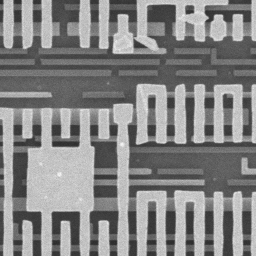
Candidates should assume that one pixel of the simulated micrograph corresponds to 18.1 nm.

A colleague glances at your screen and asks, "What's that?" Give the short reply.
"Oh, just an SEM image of wiring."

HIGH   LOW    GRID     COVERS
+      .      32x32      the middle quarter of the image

................................
................................
................................
................................
................................
..................+++++++....+..
..................+++++++...++..
..................+++..++...++..
..................+++..++...++..
..................+++..++...++..
.............++++.+++..++...++..
+...++...++..++++.+++..+++..++..
+...++...++..++++.+++..+++..++..
+...++...++..++++.+++..+++..++..
+...++...++..++++.+++..+++..++..
+...++...++...++..+++..++...++..
+...++...++...++..+++..++...++..
+...++...++...++..+++..++...++..
....++....+..+++..+++..++...+++.
....+++......+++..+++..++...+++.
....+++......+++................
+++++++......+++................
+++++++......+++................
+++++++.......++................
+++++++.......++................
+++++++.......++................
+++++++.......++................
+++++++.......++................
+++++++......+++................
+++++++......+++................
+++++++......+++................
+++++++......+++................